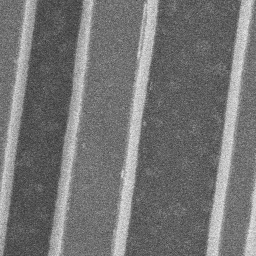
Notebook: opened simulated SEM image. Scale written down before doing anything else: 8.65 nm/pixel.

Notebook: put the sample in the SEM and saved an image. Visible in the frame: one or a few lines or trenches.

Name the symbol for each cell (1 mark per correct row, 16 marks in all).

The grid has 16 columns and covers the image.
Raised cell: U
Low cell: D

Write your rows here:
UUDDDUUUUUDDDDDU
UUDDDUUUUDDDDDDU
UUDDDUUUUDDDDDDU
UUDDDUUUUDDDDDDU
UDDDDUUUUDDDDDDU
UDDDDUUUUDDDDDDU
UDDDDUUUUDDDDDUU
UDDDDUUUUDDDDDUU
UDDDUUUUDDDDDDUU
UDDDUUUUDDDDDDUU
UDDDUUUUDDDDDDUU
DDDDUUUUDDDDDDUU
DDDDUUUUDDDDDDUU
DDDDUUUUDDDDDDUU
DDDDUUUUDDDDDUUU
DDDUUUUUDDDDDUUU